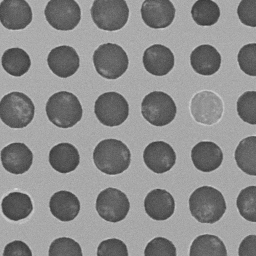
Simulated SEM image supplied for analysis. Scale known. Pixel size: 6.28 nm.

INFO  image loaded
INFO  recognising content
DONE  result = a regular array of holes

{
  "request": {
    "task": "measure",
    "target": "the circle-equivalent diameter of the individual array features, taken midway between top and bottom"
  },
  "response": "203 nm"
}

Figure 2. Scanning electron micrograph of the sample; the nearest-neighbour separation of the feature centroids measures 298 nanometres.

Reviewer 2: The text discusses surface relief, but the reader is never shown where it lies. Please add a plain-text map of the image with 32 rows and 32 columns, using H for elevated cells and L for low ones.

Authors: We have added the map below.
LLLHHHLLLLHHLLLLHHLLLLHHLLLHHHLL
LLLLHHLLLLHLLLLLHHLLLLHHLLLLHHLL
LLLLHHLLLLHHLLLLHHLLLLHHLLLHHHLL
HLLHHHHLLHHHLLLHHHHLHHHHHHHHHHHH
HHHHHHHHHHHHHHHHHHHHHHHHHHHHHHHH
HHHHHHHHHHHHHLLHHHHHHHHHHHHHHHHL
HLLHHHLLLLHHLLLLHHLLLHHHLLLHHHLL
LLLLHHLLLLHHLLLLHHLLLLHHLLLLHHLL
LLLLHHLLLLHHLLLLHHLLLLHHLLLHHHLL
HHLHHHHLLHHHHLLHHHHHHHHHHHHHHHHH
HHHHHHHHHHHHHHHHHHHHHHHHHHHHHHHH
HLLHHHHLHHHHHLLHHHHLHHHHHLLHHHHL
LLLLHHLLLLHHLLLLHHLLLLHHLLLLHHLL
LLLLHHLLLLHHLLLLHHLLLLHHLLLLHHLL
LLLLHHLLLLHHLLLLHHLLLLHHLLLLHHLL
HLLLHHHLLHHHHLLHHHHLLHHHHLLHHHHH
HHHHHHHHHHHHHHHHHHHHHHHHHHHHHHHH
HHHHHHHHHHHHHLLHHHHHHHHHHHHHHHLL
LLLLHHHLLHHHLLLLHHLLLLHHLLLHHHLL
LLLLHHLLLLHHLLLLHHLLLLHHLLLLHLLL
LLLLHHLLLLHHLLLLHHLLLLHHLLLLHHLL
HLLHHHHLLHHHHLLHHHHLLHHHHLHHHHHL
HHHHHHHHHHHHHHHHHHHHHHHHHHHHHHHH
HHHHHHHHHHHHHLHHHHHHHHHHHLLHHHHL
HLLHHHLLLHHHLLLLHHLLLHHHLLLLHHLL
LLLLHHLLLLHHLLLLHHLLLLHHLLLLHHLL
LLLLHHLLLLHHLLLLHHLLLLHHLLLLHHLL
HHHHHHHLLHHHHLLHHHHLLHHHHLLHHHHL
HHHHHHHHHHHHHHHHHHHHHHHHHHHHHHHH
HHHHHHHHHHHHHHHHHHHHHHHHHLLHHHHL
HLLHHHLLLLHHHLLLHHHLLLHHLLLLHHLL
LLLLHHLLLLHHLLLLHHLLLLHHLLLLHHLL